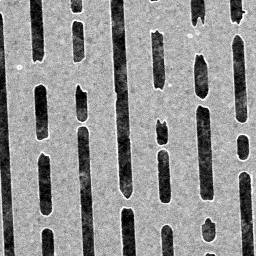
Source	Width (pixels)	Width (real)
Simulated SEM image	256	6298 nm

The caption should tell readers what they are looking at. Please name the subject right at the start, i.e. parallel lines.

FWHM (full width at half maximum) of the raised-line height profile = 682 nm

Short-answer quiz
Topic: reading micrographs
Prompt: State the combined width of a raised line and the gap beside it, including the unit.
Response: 986 nanometres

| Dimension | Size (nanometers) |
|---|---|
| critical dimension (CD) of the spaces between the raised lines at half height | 310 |